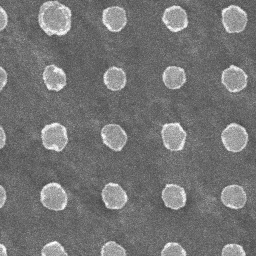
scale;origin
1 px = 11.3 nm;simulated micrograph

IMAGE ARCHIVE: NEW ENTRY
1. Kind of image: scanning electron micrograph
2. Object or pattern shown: a regular array of raised bodies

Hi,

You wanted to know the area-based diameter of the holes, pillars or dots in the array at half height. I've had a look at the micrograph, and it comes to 282 nm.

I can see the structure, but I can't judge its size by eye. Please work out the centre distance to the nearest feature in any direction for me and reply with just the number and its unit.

0.667 microns